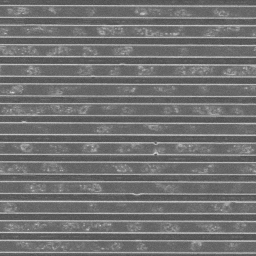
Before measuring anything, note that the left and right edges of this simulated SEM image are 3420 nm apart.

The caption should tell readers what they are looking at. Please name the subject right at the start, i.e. parallel lines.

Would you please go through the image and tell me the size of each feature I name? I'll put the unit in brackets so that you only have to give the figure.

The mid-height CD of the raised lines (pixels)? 12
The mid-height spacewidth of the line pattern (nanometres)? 93.5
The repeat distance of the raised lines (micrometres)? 0.261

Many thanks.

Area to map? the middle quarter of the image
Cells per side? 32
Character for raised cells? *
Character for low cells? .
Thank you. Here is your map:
********************************
********************************
********************************
................................
................................
********************************
********************************
********************************
................................
................................
********************************
********************************
********************************
................................
................................
********************************
********************************
********************************
................................
................................
********************************
********************************
********************************
................................
................................
********************************
********************************
................................
................................
********************************
********************************
********************************